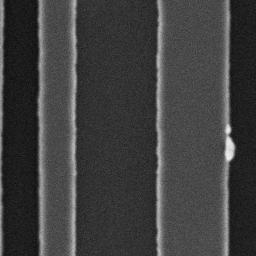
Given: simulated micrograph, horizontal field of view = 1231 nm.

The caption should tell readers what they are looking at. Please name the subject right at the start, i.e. lines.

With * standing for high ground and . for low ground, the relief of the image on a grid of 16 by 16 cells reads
..***.....****..
..***.....****..
..***.....****..
...**.....****..
..***.....****..
...**.....****..
..***.....****..
..***.....****..
...**.....****..
...**.....*****.
...**.....****..
...**.....****..
...**.....****..
...**.....****..
...**.....****..
...**.....****..